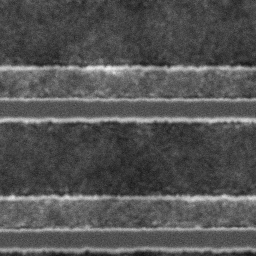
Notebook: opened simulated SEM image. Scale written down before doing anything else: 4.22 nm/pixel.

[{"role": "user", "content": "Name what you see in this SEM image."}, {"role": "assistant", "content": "lines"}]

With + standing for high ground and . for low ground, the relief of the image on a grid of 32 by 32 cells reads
................................
................................
................................
................................
................................
................................
................................
................................
+..+.+++++..+..+.++.......+++++.
++++++++++++++++++++++++++++++++
++++++++++++++++++++++++++++++++
++++++++++++++++++++++++++++++++
++++++++++++++++++++++++++++++++
++++++++++++++++++++++++++++++++
++++++++++++++++++++++++++++++++
................................
................................
................................
................................
................................
................................
................................
................................
................................
................................
++++++++++++++++++++++++++++++++
++++++++++++++++++++++++++++++++
++++++++++++++++++++++++++++++++
++++++++++++++++++++++++++++++++
++++++++++++++++++++++++++++++++
++++++++++++++++++++++++++++++++
................................